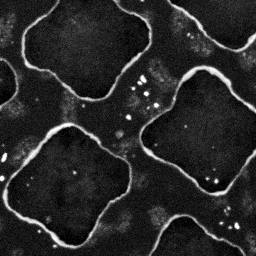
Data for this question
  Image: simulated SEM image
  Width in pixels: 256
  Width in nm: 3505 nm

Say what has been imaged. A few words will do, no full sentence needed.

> holes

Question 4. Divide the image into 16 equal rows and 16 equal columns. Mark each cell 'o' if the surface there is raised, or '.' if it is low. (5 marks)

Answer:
ooo.....ooo.....
oo.......ooo....
o........oooo...
oo.......ooooooo
.oo.....oooo.ooo
.ooo...oooo...oo
ooooooooooo....o
oooooooooo......
ooo...ooo.......
oo.....oo.......
o.......ooo....o
o.......oooo..oo
.......ooooooooo
o.....oooooooooo
ooo...oooo...ooo
oooooooooo.....o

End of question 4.